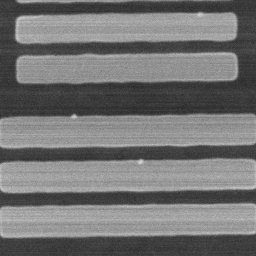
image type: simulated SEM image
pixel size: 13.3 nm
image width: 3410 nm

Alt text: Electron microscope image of groups of lines, slits or small figures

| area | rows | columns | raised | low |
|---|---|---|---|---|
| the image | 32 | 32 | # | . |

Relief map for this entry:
................................
................................
..###########################...
..############################..
..###########################...
................................
................................
..###########################...
..############################..
..###########################...
................................
................................
................................
................................
.........#...........#.#########
################################
################################
################################
................................
................................
################################
################################
################################
################################
................................
................................
################################
################################
################################
###.............................
................................
................................